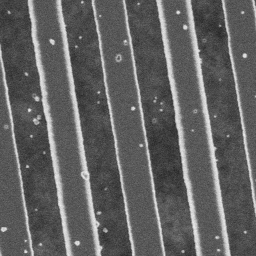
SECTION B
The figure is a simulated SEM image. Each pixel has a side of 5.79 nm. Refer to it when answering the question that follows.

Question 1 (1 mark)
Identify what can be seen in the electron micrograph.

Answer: lines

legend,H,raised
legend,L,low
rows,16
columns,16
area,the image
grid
LLHHLLHHLLHHLLHH
LLHHLLHHLLHHLLHH
LLHHLLHHLLHHLLHH
LLHHLLHHLLHHLLHH
LLHHLLHHLLLHHLLH
LLLHHLLHHLLHHLLH
HLLHHLLHHLLHHLLH
HLLHHLLHHLLHHLLH
HLLHHLLHHLLHHLLH
HLLHHLLHHLLHHLLH
HLLHHLLHHLLHHLLL
HLLLHHLLHHLLHHLL
HHLLHHLLHHLLHHLL
HHLLHHLLHHLLHHLL
HHLLHHLLHHLLHHLL
HHLLHHLLHHLLHHLL